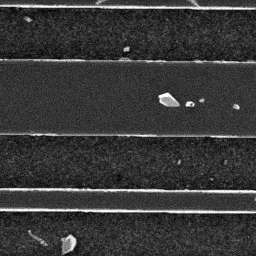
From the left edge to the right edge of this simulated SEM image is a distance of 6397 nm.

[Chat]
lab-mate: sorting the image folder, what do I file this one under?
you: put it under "lines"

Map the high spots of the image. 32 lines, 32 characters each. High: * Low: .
********************************
................................
................................
................................
................................
................................
................................
*...............................
********************************
********************************
********************************
********************************
********************************
********************************
********************************
********************************
********************************
................................
................................
................................
................................
................................
................................
................................
********************************
********************************
........................********
................................
................................
................................
................................
................................